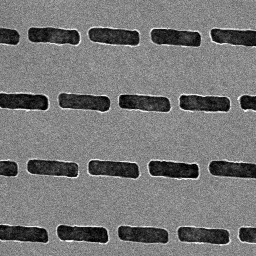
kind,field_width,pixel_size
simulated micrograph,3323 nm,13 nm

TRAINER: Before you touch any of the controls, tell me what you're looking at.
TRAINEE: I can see a regular array of holes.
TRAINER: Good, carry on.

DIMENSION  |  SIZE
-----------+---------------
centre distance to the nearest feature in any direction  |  0.783 micrometres